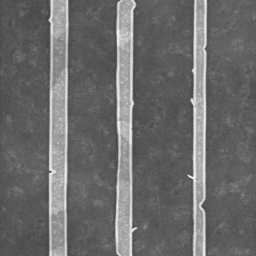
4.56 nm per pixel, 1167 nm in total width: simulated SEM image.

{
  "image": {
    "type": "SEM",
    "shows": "one or a few lines or trenches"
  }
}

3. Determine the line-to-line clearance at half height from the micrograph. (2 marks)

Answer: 258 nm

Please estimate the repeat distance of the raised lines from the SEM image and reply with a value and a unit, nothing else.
0.322 microns